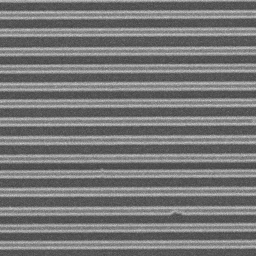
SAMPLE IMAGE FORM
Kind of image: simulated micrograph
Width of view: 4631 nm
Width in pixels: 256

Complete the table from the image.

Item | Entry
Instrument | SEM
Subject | parallel lines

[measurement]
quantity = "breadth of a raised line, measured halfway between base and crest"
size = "0.122 um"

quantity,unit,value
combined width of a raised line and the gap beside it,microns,0.32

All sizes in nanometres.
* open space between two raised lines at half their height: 190